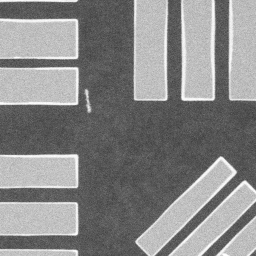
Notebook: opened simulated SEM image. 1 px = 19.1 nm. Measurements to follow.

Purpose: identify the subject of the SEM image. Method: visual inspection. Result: groups of lines, slits or small figures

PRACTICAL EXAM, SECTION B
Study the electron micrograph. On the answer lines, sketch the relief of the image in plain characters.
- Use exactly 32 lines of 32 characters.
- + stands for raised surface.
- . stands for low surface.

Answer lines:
.................++++..++++..+++
.................++++..++++..+++
+................++++..++++..+++
++++++++++.......++++..++++..+++
++++++++++.......++++..++++..+++
++++++++++.......++++..++++..+++
++++++++++.......++++..++++..+++
.................++++..++++..+++
.................++++..++++..+++
++++++++++.......++++..++++..+++
++++++++++.......++++..++++..+++
++++++++++.......++++..++++..+++
++++++++++.........+...........+
................................
................................
................................
................................
................................
................................
................................
++++++++++.................+....
++++++++++................+++...
++++++++++...............++++...
........................++++..+.
.......................++++..+++
+++++++++.............++++..++++
++++++++++...........++++..++++.
++++++++++..........++++..++++..
++++++++++.........++++..++++.++
..................++++..++++.+++
.................++++..+++...+++
+++++++++.........++..+++...++++